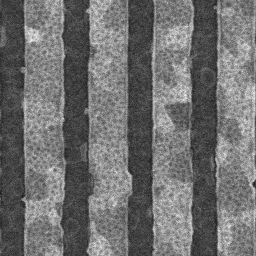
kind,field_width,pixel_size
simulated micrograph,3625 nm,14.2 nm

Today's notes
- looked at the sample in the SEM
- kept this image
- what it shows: one or a few lines or trenches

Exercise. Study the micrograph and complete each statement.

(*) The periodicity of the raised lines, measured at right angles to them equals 0.907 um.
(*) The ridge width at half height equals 37.1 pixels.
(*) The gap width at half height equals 382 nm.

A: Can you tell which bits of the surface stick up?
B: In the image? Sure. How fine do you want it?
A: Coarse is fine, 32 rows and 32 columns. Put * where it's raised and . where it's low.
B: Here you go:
...*****...*****...*****...*****
...*****...*****...*****...*****
...*****...*****...*****...*****
...*****...*****...*****...*****
...*****...*****...*****...*****
...*****...*****...*****...*****
...*****...*****...*****...*****
...*****...*****...*****...*****
...*****...*****...*****...*****
...*****...*****...*****...*****
...*****...*****...*****...*****
...*****...*****...*****...*****
...*****...*****...*****...*****
...*****...*****...*****...*****
...*****...*****...*****...*****
...*****...*****...*****...*****
...*****...*****...*****...*****
...*****...*****...*****...*****
...*****...*****...*****...*****
...*****...*****...*****...*****
...*****...*****...*****...*****
...*****...*****...*****...*****
...*****....****...*****...*****
...*****....****...*****...*****
...*****...*****...*****...*****
...*****...*****...*****...*****
...*****...*****...*****...*****
...*****...*****...*****...*****
...*****...*****...*****...*****
...*****...*****...*****...*****
...*****...*****...*****...*****
...*****...*****...*****...*****